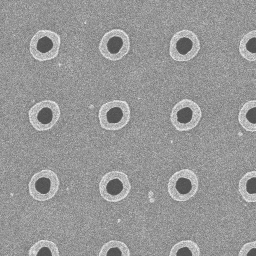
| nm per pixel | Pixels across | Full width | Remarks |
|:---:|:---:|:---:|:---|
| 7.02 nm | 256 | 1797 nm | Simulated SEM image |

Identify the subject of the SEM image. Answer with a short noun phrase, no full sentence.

a regular array of ring-shaped raised bodies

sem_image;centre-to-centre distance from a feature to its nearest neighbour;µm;0.488